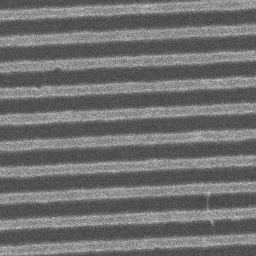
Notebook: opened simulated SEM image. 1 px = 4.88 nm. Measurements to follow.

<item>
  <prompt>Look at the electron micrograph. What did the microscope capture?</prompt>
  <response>parallel lines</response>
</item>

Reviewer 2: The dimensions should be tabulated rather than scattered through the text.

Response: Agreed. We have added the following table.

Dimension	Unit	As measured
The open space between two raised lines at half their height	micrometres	0.0682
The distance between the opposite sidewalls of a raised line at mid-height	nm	58.4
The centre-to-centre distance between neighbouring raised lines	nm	127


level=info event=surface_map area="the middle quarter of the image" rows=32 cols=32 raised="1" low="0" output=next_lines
11111111111111111111111010000000
11101000000000000000000000000000
00000000000000000000000000000000
00000000000000000000000000000000
00000000000000000101001111111111
11111111111111111111111111111111
11111111111111111111111111111111
11111111111110000000000000000000
00000000000000000000000000000000
00000000000000000000000000000000
00000000000000000000000000001111
00000001110111111111111111111111
11111111111111111111111111111111
11111111111111111111101000000000
11100000000000000000000000000000
00000000000000000000000000000000
00000000000000000000000000000000
00000000000000000100001111111111
01111111111111111111111111111111
11111111111111111111111111111111
11111111111111000000000000000000
00000000000000000000000000000000
00000000000000000000000000000000
00000000000000000000000000000000
00000000010011111111111111111111
11111111111111111111111111111111
11111111111111111111111011110000
11101110000000000000000000000000
00000000000000000000000000000000
00000000000000000000000000000000
00000000000000000001101111111111
01111111111111111111111111111111